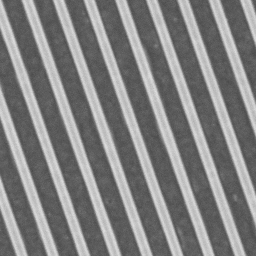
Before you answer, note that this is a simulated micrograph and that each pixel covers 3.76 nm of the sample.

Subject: parallel lines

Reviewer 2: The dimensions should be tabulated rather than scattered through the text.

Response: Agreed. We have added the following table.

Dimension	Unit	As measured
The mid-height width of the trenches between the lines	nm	73.7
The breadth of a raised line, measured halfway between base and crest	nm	36.9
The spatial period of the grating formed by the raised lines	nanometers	111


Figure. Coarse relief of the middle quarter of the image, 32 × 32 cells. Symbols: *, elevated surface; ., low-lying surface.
...***.....**.....***.....***...
...***.....***.....**......**...
....**.....***.....***.....***..
....***.....**......**......**..
.....**.....***.....**......**..
.....**.....***.....***.....***.
.....***.....**......**......**.
......**.....***.....**......**.
*.....**.....***.....***.....***
*.....***.....**......**......**
*......**.....***.....***.....**
**.....**......**.....***.....**
**.....***.....**......**......*
**......**.....***.....***.....*
***.....**......**.....***.....*
***.....***.....**......**......
.**......**.....***.....***.....
.***.....**......**.....***.....
.***.....***.....***.....**.....
..**......**.....***.....***....
..***.....**......**.....***....
..***.....***.....***.....**....
...**......**.....***.....***...
...***.....***.....**......**...
....**.....***.....***.....**...
....**......**.....***.....***..
....***.....***.....**.....***..
.....**.....***.....***.....**..
.....**......**.....***.....***.
.....***.....***.....**......**.
......**.....***.....***.....**.
*.....***.....**.....***.....***